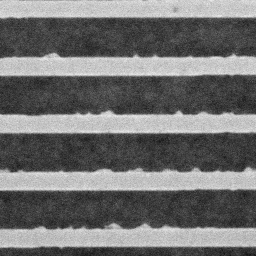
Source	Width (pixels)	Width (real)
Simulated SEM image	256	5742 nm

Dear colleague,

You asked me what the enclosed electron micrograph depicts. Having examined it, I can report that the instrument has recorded lines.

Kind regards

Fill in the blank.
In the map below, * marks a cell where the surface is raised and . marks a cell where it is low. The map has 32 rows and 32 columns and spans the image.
********************************
********************************
................................
................................
................................
................................
................................
********************************
********************************
................................
................................
................................
................................
................................
****.***************************
********************************
****************************.***
................................
................................
................................
................................
..........................***.**
********************************
********************************
................................
................................
................................
................................
................................
********************************
********************************
................................